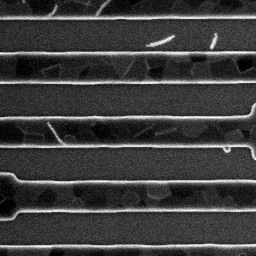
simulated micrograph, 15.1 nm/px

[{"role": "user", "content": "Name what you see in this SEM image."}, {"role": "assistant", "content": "wiring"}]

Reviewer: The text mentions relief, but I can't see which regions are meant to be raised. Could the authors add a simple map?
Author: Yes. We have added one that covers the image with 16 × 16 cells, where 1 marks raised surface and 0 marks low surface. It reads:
1111111111111111
0000000000000000
0000000000000000
1111111111111111
1111111111111111
0000000000000000
0000000000000000
1111111111111111
1111111111111111
0000000000000000
0000000000000000
1111111111111111
1111111111111111
1000000000000000
0000000000000000
1111111111111111